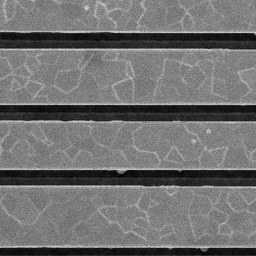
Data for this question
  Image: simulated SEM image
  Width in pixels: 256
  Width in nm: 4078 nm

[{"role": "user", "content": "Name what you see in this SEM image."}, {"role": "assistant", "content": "lines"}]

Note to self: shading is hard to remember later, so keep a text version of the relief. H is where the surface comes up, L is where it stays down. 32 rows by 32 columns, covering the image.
HHHHHHHHHHHHHHHHHHHHHHHHHHHHHHHH
HHHHHHHHHHHHHHHHHHHHHHHHHHHHHHHH
HHHHHHHHHHHHHHHHHHHHHHHHHHHHHHHH
HHHHHHHHHHHHHHHHHHHHHHHHHHHHHHHH
LLLLLLLLLLLLLLLLLLLLLLLLLLLLLLLL
LLLLLLLLLLLLLLLLLLLLLLLLLLLLLLLL
HHHHHHHHHHHHHHHHHHHHHHHHHHHHHHHH
HHHHHHHHHHHHHHHHHHHHHHHHHHHHHHHH
HHHHHHHHHHHHHHHHHHHHHHHHHHHHHHHH
HHHHHHHHHHHHHHHHHHHHHHHHHHHHHHHH
HHHHHHHHHHHHHHHHHHHHHHHHHHHHHHHH
HHHHHHHHHHHHHHHHHHHHHHHHHHHHHHHH
HHHHHHHHHHHHHHHHHHHHHHHHHHHHHHHH
LLLLLLLLLLLLLLLLLLLLLLLLLLLLLLLL
LLLLLLLLLLLLLLLLLLLLLLLLLLLLLLLL
HHHHHHHHHHHHHHHHHHHHHHHHHHHHHHHH
HHHHHHHHHHHHHHHHHHHHHHHHHHHHHHHH
HHHHHHHHHHHHHHHHHHHHHHHHHHHHHHHH
HHHHHHHHHHHHHHHHHHHHHHHHHHHHHHHH
HHHHHHHHHHHHHHHHHHHHHHHHHHHHHHHH
HHHHHHHHHHHHHHHHHHHHHHHHHHHHHHHH
LLLLLLLLLLLLLLLLLLLLLLLLLLLLLLLL
LLLLLLLLLLLLLLLLLLLLLLLLLLLLLLLL
HHHHHHHHHHHHHHHHHHHHHHHHHHHHHHHH
HHHHHHHHHHHHHHHHHHHHHHHHHHHHHHHH
HHHHHHHHHHHHHHHHHHHHHHHHHHHHHHHH
HHHHHHHHHHHHHHHHHHHHHHHHHHHHHHHH
HHHHHHHHHHHHHHHHHHHHHHHHHHHHHHHH
HHHHHHHHHHHHHHHHHHHHHHHHHHHHHHHH
HHHHHHHHHHHHHHHHHHHHHHHHHHHHHHHH
HHHHHHHHHHHHHHHHHHHHHHHHHHHHHHHH
LLLLLLLLLLLLLLLLLLLLLLLLLLLLLLLL